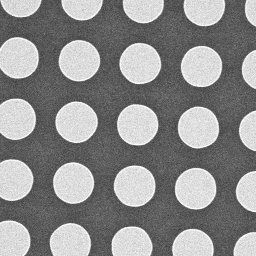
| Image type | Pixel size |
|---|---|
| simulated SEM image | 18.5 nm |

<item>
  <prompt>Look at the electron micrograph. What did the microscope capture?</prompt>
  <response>an array of small figures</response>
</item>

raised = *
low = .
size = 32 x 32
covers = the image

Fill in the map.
*****...*****..*****...*****...*
.***....****....****...*****...*
.................**.....***....*
................................
................................
****.....**......*..............
*****...****....****...****.....
*****..*****...*****...*****...*
****....****...*****...*****..**
.**.....****....****...****...**
........................**.....*
................................
.**.............................
****....***.....***.....**......
****...*****...****....****....*
****...*****...*****..*****...**
****...*****...*****..*****...**
........***.....***....****...**
...............................*
................................
***.....**......................
****...****....****....***......
****...*****..*****...*****...**
****...*****..*****...*****...**
***....****....****...*****...**
................**.....***....**
................................
................................
***....***......*...............
****..*****...*****...****....**
****..*****...*****...*****...**
***....****...*****...*****..***